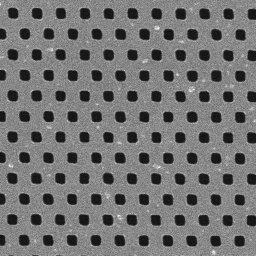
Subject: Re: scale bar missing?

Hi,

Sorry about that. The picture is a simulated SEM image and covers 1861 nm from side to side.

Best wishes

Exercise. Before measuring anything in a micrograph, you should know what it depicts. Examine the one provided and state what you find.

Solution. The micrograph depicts a regular array of holes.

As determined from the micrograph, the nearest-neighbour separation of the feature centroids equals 0.171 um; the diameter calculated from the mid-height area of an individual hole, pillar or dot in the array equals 82.8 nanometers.